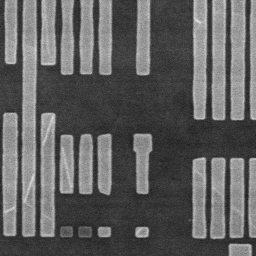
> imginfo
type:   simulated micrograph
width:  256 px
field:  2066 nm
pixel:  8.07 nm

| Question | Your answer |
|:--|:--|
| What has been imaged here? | wiring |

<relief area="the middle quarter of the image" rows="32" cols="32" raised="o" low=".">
oo..ooo..ooo......ooo...........
oo..ooo..ooo......ooo...........
...................oo...........
................................
................................
................................
................................
................................
................................
................................
................................
................................
................................
................................
................................
................................
................................
................................
oo..ooo..ooo......oooo..........
oo..ooo..ooo......oooo..........
oo..ooo.oooo......oooo..........
oo..ooo..ooo......oooo..........
oo..ooo..ooo......ooo...........
oo..ooo..ooo......ooo...........
oo..ooo..ooo......ooo...........
oo..ooo..ooo......ooo...........
oo..ooo..ooo......ooo...........
oo..ooo..ooo......ooo...........
oo..ooo..ooo......ooo...........
oo..ooo..ooo......ooo...........
oo..ooo..ooo......ooo...........
oo..ooo..oo.......ooo...........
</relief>